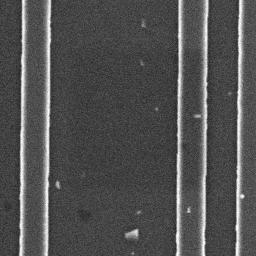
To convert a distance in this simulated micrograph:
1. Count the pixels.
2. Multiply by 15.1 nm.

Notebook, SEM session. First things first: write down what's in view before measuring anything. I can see lines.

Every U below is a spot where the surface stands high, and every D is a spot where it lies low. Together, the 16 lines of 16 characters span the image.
DUUDDDDDDDDUUDDU
DUUDDDDDDDDUUDDU
DUUDDDDDDDDUUDDU
DUUDDDDDDDDUUDDU
DUUDDDDDDDDUUDDU
DUUDDDDDDDDUUDDU
DUUDDDDDDDDUUDDU
DUUDDDDDDDDUUDDU
DUUDDDDDDDDUUDDU
DUUDDDDDDDDUUDDU
DUUDDDDDDDDUUDDU
DUUDDDDDDDDUUDDU
DUUDDDDDDDDUUDDU
DUUDDDDDDDDUUDDU
DUUDDDDDDDDUUDDU
DUUDDDDDDDDUUDDU